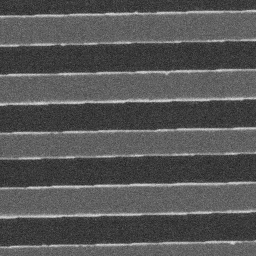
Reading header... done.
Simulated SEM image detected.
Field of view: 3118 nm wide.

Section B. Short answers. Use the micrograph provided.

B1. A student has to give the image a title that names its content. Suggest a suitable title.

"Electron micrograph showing lines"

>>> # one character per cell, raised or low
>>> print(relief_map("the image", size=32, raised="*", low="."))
................................
........................********
********************************
********************************
********************************
*******.........................
................................
................................
................................
********************************
********************************
********************************
**************************......
................................
................................
................................
........************************
********************************
********************************
**************..................
................................
................................
................................
...*****************************
********************************
********************************
*******************************.
................................
................................
................................
................****************
********************************